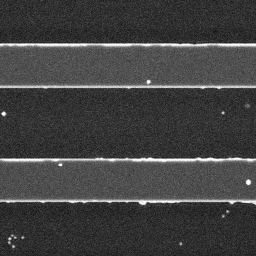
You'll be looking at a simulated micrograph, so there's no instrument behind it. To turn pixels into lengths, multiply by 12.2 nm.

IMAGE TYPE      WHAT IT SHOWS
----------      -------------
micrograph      lines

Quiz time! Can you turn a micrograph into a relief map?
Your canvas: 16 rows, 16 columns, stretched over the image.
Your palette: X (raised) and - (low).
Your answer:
----------------
----------------
----------------
XXXXXXXXXXXXXXXX
XXXXXXXXXXXXXXXX
----------------
----------------
----------------
----------------
----------------
XXXXXXXXXXXXXXXX
XXXXXXXXXXXXXXXX
XXXXXXXXXXXXXXXX
----------------
----------------
----------------